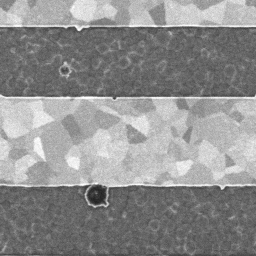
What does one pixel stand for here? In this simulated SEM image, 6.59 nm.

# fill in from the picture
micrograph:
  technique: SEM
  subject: one or a few lines or trenches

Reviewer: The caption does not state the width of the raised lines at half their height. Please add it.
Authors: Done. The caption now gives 88.5 pixels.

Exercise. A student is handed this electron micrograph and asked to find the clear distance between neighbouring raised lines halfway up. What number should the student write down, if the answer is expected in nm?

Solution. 466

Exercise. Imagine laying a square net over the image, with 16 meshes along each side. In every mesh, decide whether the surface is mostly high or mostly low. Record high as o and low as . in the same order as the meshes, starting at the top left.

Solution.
oooooooooooooooo
oooooooooooooooo
................
................
................
................
oooooooooooooooo
oooooooooooooooo
oooooooooooooooo
oooooooooooooooo
oooooooooooooooo
oooooooooooooooo
.....oo.........
................
................
................